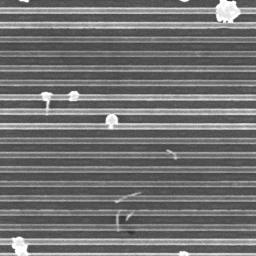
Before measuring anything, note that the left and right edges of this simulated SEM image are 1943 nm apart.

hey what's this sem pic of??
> parallel lines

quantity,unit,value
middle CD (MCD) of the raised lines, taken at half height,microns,0.0436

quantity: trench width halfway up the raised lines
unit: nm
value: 65.5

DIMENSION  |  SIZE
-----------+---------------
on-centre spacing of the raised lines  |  110 nm